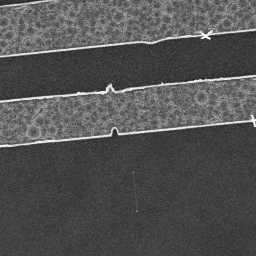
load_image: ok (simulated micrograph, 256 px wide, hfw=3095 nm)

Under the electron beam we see one or a few lines or trenches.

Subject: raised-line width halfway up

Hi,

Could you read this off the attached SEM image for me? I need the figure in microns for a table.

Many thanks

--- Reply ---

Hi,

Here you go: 0.548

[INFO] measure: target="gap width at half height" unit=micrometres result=0.542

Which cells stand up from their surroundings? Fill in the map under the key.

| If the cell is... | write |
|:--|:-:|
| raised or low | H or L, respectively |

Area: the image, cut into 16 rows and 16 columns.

HHHHHHHHHHHHHHHH
HHHHHHHHHHHHHHHH
HHHHHHHHHHLLLLLL
LLLLLLLLLLLLLLLL
LLLLLLLLLLLLLLLL
LLLLLLLLHHHHHHHH
HHHHHHHHHHHHHHHH
HHHHHHHHHHHHHHHH
HHHHHHHLLLLLLLLL
LLLLLLLLLLLLLLLL
LLLLLLLLLLLLLLLL
LLLLLLLLLLLLLLLL
LLLLLLLLLLLLLLLL
LLLLLLLLLLLLLLLL
LLLLLLLLLLLLLLLL
LLLLLLLLLLLLLLLL